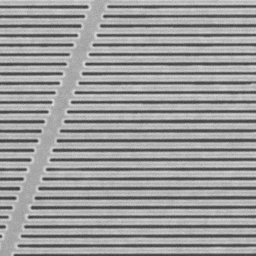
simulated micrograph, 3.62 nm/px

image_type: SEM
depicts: parallel lines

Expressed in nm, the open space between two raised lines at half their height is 14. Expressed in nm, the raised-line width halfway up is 20.8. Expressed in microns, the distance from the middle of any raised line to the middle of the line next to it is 0.0346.